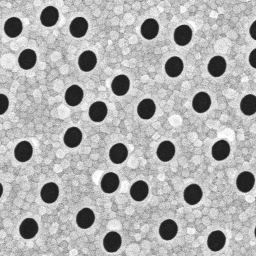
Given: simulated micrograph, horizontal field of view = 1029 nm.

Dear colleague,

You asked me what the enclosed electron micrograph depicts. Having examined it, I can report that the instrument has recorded a regular array of holes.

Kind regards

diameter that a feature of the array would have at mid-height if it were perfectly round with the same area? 78.7 nm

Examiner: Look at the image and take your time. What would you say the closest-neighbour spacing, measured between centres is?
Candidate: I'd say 141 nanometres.